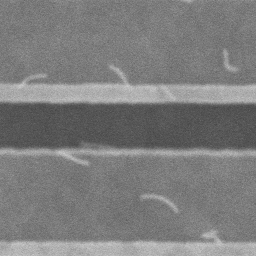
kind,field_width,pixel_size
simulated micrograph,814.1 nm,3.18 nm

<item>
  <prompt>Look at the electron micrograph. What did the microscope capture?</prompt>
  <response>lines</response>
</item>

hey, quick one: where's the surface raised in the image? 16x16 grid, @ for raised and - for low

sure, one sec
@@@@@@@@@@@@@@@@
@@@@@@@@@@@@@@@@
@@@@@@@@@@@@@@@@
@@@@@@@@@@@@@@@@
@@@@@@@@@@@@@@@@
@@@@@@@@@@@@@@@@
----------------
----------------
----------------
@-@@@@----------
@@@@@@@@@@@@@@@@
@@@@@@@@@@@@@@@@
@@@@@@@@@@@@@@@@
@@@@@@@@@@@@@@@@
@@@@@@@@@@@@@@@@
@@@@@@@@@@@@@@@@